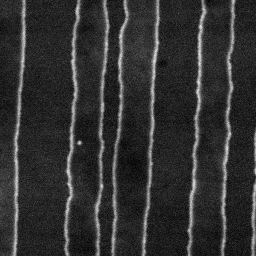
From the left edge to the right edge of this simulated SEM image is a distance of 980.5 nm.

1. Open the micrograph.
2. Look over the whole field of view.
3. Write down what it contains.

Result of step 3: lines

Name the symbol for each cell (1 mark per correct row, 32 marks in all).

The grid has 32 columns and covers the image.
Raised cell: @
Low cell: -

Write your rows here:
@@@-------@@@---@@@@-----@@@@---
@@@-------@@@---@@@@-----@@@@---
@@@-------@@@---@@@@-----@@@@---
@@@------@@@@--@@@@@-----@@@@---
@@@------@@@@--@@@@@-----@@@@---
@@@------@@@@--@@@@@-----@@@@---
@@@------@@@@--@@@@@-----@@@@---
@@@------@@@@--@@@@------@@@@---
@@@------@@@@--@@@@------@@@@---
@@@------@@@@--@@@@------@@@@---
@@@------@@@@--@@@@------@@@@---
@@@------@@@@--@@@@------@@@@---
@@-------@@@@--@@@@------@@@@---
@@-------@@@@--@@@@------@@@@---
@@-------@@@@--@@@@------@@@@---
@@-------@@@@--@@@@------@@@@---
@@-------@@@@--@@@@------@@@@---
@@-------@@@@--@@@@------@@@@---
@@-------@@@@-@@@@@-----@@@@----
@@-------@@@@-@@@@@-----@@@@----
@@-------@@@@-@@@@@-----@@@@----
@@-------@@@@-@@@@@-----@@@@----
@@-------@@@@-@@@@@-----@@@@----
@@-------@@@@-@@@@@-----@@@@----
@@-------@@@@-@@@@@-----@@@@----
@@------@@@@--@@@@@-----@@@@----
@@------@@@@--@@@@------@@@@----
@@------@@@@--@@@@------@@@@----
@@------@@@@--@@@@------@@@@----
@@------@@@@--@@@@------@@@@----
@@------@@@@--@@@@------@@@@----
@@------@@@@--@@@@-----@@@@@---@